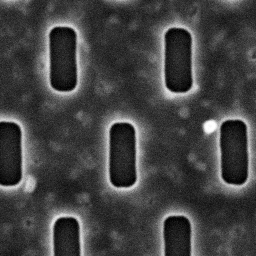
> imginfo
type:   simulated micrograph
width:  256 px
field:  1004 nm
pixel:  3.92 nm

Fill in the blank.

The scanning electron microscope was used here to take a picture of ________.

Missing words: holes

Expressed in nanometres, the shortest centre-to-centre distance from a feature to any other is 426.